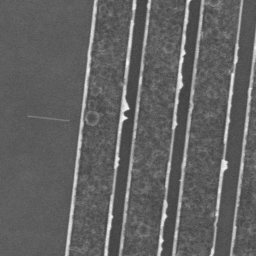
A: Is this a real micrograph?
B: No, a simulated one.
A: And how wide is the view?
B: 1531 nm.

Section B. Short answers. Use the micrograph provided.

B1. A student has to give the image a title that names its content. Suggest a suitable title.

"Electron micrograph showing parallel lines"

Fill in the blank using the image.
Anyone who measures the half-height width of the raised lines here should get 242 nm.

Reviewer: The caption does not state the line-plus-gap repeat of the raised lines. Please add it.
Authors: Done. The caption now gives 317 nanometers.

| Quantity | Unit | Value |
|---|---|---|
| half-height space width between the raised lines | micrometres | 0.075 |